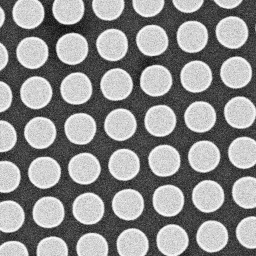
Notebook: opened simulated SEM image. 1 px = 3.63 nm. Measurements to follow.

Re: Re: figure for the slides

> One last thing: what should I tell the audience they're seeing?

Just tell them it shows an array of small figures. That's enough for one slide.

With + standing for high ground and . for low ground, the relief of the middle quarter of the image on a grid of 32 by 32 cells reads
......................++......++
............+++.....++++++....++
..+++.....++++++....+++++++..+++
++++++....+++++++..++++++++..+++
++++++...++++++++..++++++++..+++
+++++++..++++++++..++++++++...++
+++++++..++++++++...++++++.....+
+++++++...++++++.....++++.......
++++++.....++++.................
.++++...........................
.......................++......+
.............+++.....++++++....+
...++......++++++....+++++++..++
.++++++....+++++++..++++++++..++
++++++++..++++++++..++++++++..++
++++++++..++++++++..++++++++...+
++++++++..++++++++...++++++.....
.+++++++...++++++.....++++......
.++++++.....++++................
..++++..........................
........................++......
..............++......++++++....
....+++.....++++++....+++++++..+
..++++++....+++++++..++++++++..+
.++++++++..++++++++..++++++++..+
.++++++++..++++++++..++++++++...
.++++++++..++++++++...++++++....
.++++++++...++++++.....++++.....
..++++++.....++++...............
...++++.........................
.........................++.....
...............++......++++++...